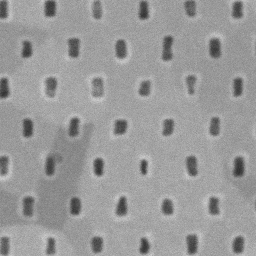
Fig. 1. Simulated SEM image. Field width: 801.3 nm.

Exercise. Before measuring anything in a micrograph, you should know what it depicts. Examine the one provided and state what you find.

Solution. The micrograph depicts a regular array of holes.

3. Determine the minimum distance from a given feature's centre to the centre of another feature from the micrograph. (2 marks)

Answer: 141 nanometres